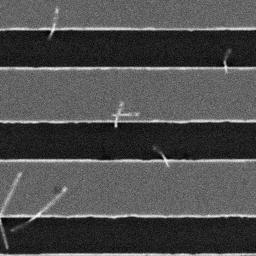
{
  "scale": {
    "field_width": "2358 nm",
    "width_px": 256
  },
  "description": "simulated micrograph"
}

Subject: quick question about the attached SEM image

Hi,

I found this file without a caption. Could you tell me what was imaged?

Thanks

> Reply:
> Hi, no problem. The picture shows lines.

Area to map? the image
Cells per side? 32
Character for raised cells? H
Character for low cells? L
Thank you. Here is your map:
HHHHHHHHHHHHHHHHHHHHHHHHHHHHHHHH
HHHHHHHHHHHHHHHHHHHHHHHHHHHHHHHH
HHHHHHHHHHHHHHHHHHHHHHHHHHHHHHHH
HHHHHHHHHHHHHHHHHHHHHHHHHHHHHHHH
LLLLLLLLLLLLLLLLLLLLLLLLLLLLLLLL
LLLLLLLLLLLLLLLLLLLLLLLLLLLLLLLL
LLLLLLLLLLLLLLLLLLLLLLLLLLLLLLLL
LLLLLLLLLLLLLLLLLLLLLLLLLLLLLLLL
HHHHHHHHHHHHHHHHHHHHHHHHHHHHHHHH
HHHHHHHHHHHHHHHHHHHHHHHHHHHHHHHH
HHHHHHHHHHHHHHHHHHHHHHHHHHHHHHHH
HHHHHHHHHHHHHHHHHHHHHHHHHHHHHHHH
HHHHHHHHHHHHHHHHHHHHHHHHHHHHHHHH
HHHHHHHHHHHHHHHHHHHHHHHHHHHHHHHH
HHHHHHHHHHHHHHHHHHHHHHHHHHHHHHHH
LLLLLLLLLLLLLLLLLLLLLLLLLLLLLLLL
LLLLLLLLLLLLLLLLLLLLLLLLLLLLLLLL
LLLLLLLLLLLLLLLLLLLLLLLLLLLLLLLL
LLLLLLLLLLLLLLLLLLLLLLLLLLLLLLLL
LLLLLLLLLLLLLLLLLLLLLLLLLLLLLLLL
HHHHHHHHHHHHHHHHHHHHHHHHHHHHHHHH
HHHHHHHHHHHHHHHHHHHHHHHHHHHHHHHH
HHHHHHHHHHHHHHHHHHHHHHHHHHHHHHHH
HHHHHHHHHHHHHHHHHHHHHHHHHHHHHHHH
HHHHHHHHHHHHHHHHHHHHHHHHHHHHHHHH
HHHHHHHHHHHHHHHHHHHHHHHHHHHHHHHH
HHHHHHHHHHHHHHHHHHHHHHHHHHHHHHHH
LLLLLLLLLLLLLLLLLLLLLLLLLLLLLLLL
LLLLLLLLLLLLLLLLLLLLLLLLLLLLLLLL
LLLLLLLLLLLLLLLLLLLLLLLLLLLLLLLL
LLLLLLLLLLLLLLLLLLLLLLLLLLLLLLLL
LLLLLLLLLLLLLLLLLLLLLLLLLLLLLLLL